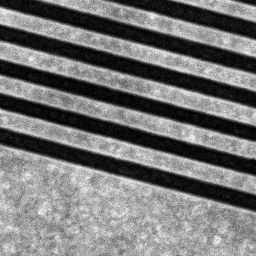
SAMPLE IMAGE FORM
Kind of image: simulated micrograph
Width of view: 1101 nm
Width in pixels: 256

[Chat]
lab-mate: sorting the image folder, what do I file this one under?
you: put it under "parallel lines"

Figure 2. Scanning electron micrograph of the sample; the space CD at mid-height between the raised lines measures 66.5 nanometers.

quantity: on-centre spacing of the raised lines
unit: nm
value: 142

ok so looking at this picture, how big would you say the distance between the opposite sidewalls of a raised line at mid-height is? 77.7 nanometers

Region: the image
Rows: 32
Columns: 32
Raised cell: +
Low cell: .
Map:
.......++++++++.........+++++++.
++........+++++++++........+++++
++++++........+++++++++........+
..++++++++........++++++++......
......++++++++........++++++++..
++.......++++++++........+++++++
+++++........++++++++........+++
+++++++++........++++++++.......
....+++++++++........++++++++...
........+++++++++........+++++++
++++........+++++++++.......++++
++++++++........++++++++........
...+++++++++.......+++++++++....
.......+++++++++.......+++++++++
+++........+++++++++.......+++++
+++++++........+++++++++.......+
..+++++++++........++++++++.....
......+++++++++.......+++++++++.
++........++++++++........++++++
++++++.......+++++++++........++
+++++++++.........++++++++......
+++++++++++++........+++++++++..
+++++++++++++++++........+++++++
+++++++++++++++++++++........+++
+++++++++++++++++++++++++.......
++++++++++++++++++++++++++++....
++++++++++++++++++++++++++++++++
++++++++++++++++++++++++++++++++
++++++++++++++++++++++++++++++++
++++++++++++++++++++++++++++++++
++++++++++++++++++++++++++++++++
++++++++++++++++++++++++++++++++